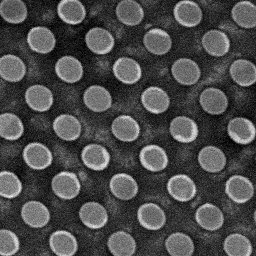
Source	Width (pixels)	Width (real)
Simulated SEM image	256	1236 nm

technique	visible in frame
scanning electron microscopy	a regular array of raised bodies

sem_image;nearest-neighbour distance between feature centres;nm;196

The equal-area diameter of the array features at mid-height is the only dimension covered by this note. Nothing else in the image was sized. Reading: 0.129 microns